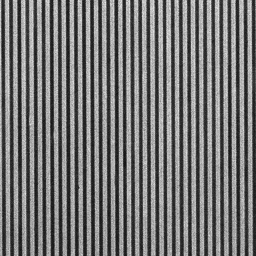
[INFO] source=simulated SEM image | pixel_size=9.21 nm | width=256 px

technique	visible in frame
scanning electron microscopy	parallel lines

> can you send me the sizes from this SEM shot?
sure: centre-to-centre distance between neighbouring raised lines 74.5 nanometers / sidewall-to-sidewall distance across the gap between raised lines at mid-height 0.0334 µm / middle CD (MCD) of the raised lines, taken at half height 0.0414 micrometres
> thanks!